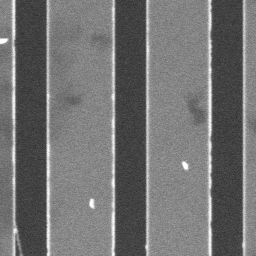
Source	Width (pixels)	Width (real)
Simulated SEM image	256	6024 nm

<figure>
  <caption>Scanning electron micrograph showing lines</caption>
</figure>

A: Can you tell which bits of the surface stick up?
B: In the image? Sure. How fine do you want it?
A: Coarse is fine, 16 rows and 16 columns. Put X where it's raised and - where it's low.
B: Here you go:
X--XXXX--XXXX--X
X--XXXX--XXXX--X
X--XXXX--XXXX--X
X--XXXX--XXXX--X
X--XXXX--XXXX--X
X--XXXX--XXXX--X
X--XXXX--XXXX--X
X--XXXX--XXXX--X
X--XXXX--XXXX--X
X--XXXX--XXXX--X
X--XXXX--XXXX--X
X--XXXX--XXXX--X
X--XXXX--XXXX--X
X--XXXX--XXXX--X
X--XXXX--XXXX--X
X--XXXX--XXXX--X